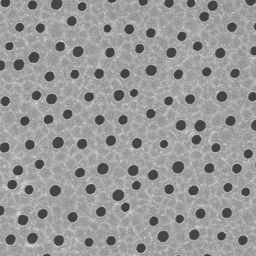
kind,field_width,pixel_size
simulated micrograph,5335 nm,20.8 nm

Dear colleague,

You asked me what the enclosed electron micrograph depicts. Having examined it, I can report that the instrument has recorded a regular array of holes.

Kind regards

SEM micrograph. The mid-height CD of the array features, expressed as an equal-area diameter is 209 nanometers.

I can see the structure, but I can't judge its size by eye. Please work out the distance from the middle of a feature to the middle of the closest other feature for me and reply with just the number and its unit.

438 nm